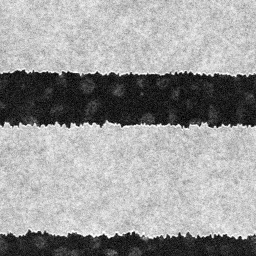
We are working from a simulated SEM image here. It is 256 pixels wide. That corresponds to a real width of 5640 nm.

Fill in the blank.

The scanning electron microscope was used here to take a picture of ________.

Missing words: one or a few lines or trenches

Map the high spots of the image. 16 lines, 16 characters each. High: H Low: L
HHHHHHHHHHHHHHHH
HHHHHHHHHHHHHHHH
HHHHHHHHHHHHHHHH
HHHHHHHHHHHHHHHH
LLLLLHHHHHHLHHHH
LLLLLLLLLLLLLLLL
LLLLLLLLLLLLLLLL
LLLLLLLLLLLLLLLL
HHHHHHHHHHHHHHHH
HHHHHHHHHHHHHHHH
HHHHHHHHHHHHHHHH
HHHHHHHHHHHHHHHH
HHHHHHHHHHHHHHHH
HHHHHHHHHHHHHHHH
HHLHHHHHHHHHHHHH
LLLLLLLLLLLLLLLL